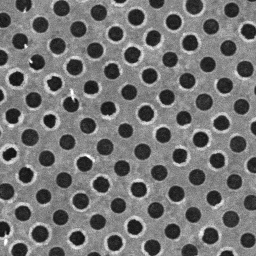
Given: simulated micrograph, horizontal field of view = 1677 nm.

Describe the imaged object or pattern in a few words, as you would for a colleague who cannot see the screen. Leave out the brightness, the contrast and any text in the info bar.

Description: a regular array of holes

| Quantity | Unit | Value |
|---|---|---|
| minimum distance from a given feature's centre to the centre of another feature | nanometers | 172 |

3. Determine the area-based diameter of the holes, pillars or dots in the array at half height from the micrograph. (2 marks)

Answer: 107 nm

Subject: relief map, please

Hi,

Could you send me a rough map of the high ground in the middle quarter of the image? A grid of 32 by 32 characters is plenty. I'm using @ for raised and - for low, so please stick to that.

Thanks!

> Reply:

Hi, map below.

@----@@@@@@--@@@@@@@@@@@@---@@@@
@----@@@@@----@@@@@@---@@@@@@@@@
@---@@@@@@----@@@@@----@@@@@@@--
@@@@@@@@@@@--@@@@@@@---@@@@@@---
@@@@@---@@@@@@@@@@@@---@@@@@@---
@@@@@----@@@@@@---@@@@@@@@@@@---
@@@@@----@@@@@----@@@@@@@--@@@@@
@@@@@@-@@@@@@@----@@@@@@----@@@@
--@@@@@@@@@@@@@---@@@@@@----@@@@
----@@@@@@--@@@@@@@@@@@@---@@@@@
----@@@@@----@@@@@@@-@@@@@@@@@@@
---@@@@@@----@@@@@@---@@@@@@@@@@
@@@@@@@@@@--@@@@@@-----@@@@@---@
@@@@@--@@@@@@@@@@@@---@@@@@@----
@@@@----@@@@@@@@@@@@@@@@@@@@----
@@@@----@@@@@@---@@@@@@@@@@@@-@@
@@@@----@@@@@----@@@@@@---@@@@@@
@@@@@@@@@@@@@@---@@@@@@----@@@@@
---@@@@@@@@@@@@-@@@@@@@----@@@@@
---@@@@@@---@@@@@@@@@@@@--@@@@@@
---@@@@@----@@@@@@---@@@@@@@@@@@
--@@@@@@----@@@@@-----@@@@@@--@@
@@@@@@@@@---@@@@@-----@@@@@----@
@@@@--@@@@@@@@@@@@---@@@@@@----@
@@@----@@@@@@---@@@@@@@@@@@@--@@
@@@----@@@@@----@@@@@@@--@@@@@@@
@@@@--@@@@@@----@@@@@@----@@@@@@
-@@@@@@@@@@@@---@@@@@@----@@@@@-
--@@@@@@--@@@@@@@@@@@@----@@@@@-
--@@@@@----@@@@@@@--@@@@@@@@@@@-
-@@@@@@-----@@@@@---@@@@@@@--@@@
@@@@@@@@---@@@@@@----@@@@@----@@